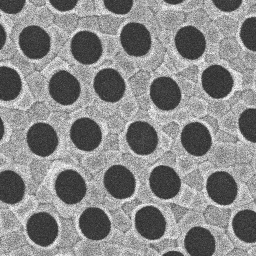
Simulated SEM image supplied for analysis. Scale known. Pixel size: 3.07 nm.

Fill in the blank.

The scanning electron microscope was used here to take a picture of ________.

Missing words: a regular array of holes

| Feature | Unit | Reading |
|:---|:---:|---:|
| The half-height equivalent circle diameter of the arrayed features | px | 32.6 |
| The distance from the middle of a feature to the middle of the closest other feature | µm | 0.139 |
